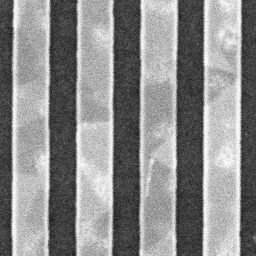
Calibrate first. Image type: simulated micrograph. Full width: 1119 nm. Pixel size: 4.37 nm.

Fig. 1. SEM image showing parallel lines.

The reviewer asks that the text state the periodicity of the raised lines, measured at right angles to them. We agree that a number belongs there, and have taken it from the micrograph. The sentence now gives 278 nm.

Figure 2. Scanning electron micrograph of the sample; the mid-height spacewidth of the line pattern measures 29.5 px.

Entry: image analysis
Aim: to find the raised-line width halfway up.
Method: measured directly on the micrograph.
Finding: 150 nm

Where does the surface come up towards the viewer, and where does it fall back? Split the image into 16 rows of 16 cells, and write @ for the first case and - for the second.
-@@--@@--@@--@@-
-@@--@@--@@--@@-
-@@--@@--@@--@@-
-@@--@@--@@--@@-
-@@--@@--@@--@@-
-@@--@@--@@--@@-
-@@--@@--@@--@@-
-@@--@@--@@--@@-
-@@--@@--@@--@@-
-@@--@@--@@--@@-
-@@--@@--@@--@@-
-@@--@@--@@--@@-
-@@--@@--@@--@@-
-@@--@@--@@--@@-
-@@--@@--@@--@@-
-@@--@@--@@--@@-